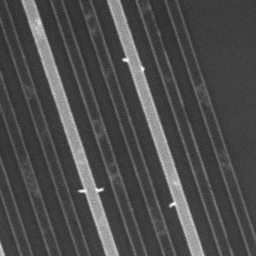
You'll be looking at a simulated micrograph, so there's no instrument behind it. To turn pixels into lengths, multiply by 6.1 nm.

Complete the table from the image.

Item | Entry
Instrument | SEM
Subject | parallel lines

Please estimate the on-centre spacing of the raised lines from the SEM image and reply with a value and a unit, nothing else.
166 nm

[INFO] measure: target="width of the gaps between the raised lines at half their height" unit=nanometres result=94.8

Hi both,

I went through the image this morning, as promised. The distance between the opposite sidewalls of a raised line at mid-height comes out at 11.3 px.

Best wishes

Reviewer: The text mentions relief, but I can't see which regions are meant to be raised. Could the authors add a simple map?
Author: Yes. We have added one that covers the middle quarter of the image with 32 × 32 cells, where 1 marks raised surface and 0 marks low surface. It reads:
00111000011100001110000011000001
00111000011100000111000011100001
00011100001110000111000011100001
00011100001110000111000011100000
00011100001110000011100001110000
00001110000111000011100001110000
00001110000111000011100001110000
00001110000111000001100000111000
10000111000011100001110000111000
10000111000011100001110000111000
10000111000011100000111000011100
11000011100001110000111000011100
11000011100001110000111000011100
11000011100001110000011100001110
11100001110000111000011100001110
11100001110000111000011100001110
11100001110000111000001110000111
01110000111000011100001110000111
01110000111000011100001110000111
01110000111000011100000111000011
00111000011100001110000111000011
00111000011100001110000111000011
00111000011100001110000011100001
00011100001110000111000011100001
00011100001110000111000011100001
00011100001110000111000001110000
00001110000111000011100001110000
00001110000111000011100001110000
00001110000111000011100000111000
00000111000011100001110000111000
10000111000011100001110000111000
10000111100011100001110000011000